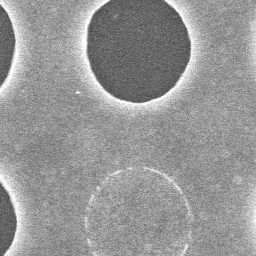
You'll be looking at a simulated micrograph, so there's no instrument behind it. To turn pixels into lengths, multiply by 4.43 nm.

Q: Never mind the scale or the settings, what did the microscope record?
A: holes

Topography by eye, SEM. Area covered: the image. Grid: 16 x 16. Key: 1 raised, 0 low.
1111110000011111
0111110000001111
0111100000001111
0111100000001111
0111110000001111
1111110000011111
1111111111111111
1111111111111111
1111111111111111
1111111111111111
1111111111111111
1111111111111111
0111111111111111
0111111111111111
0111111111111111
0111111111111111